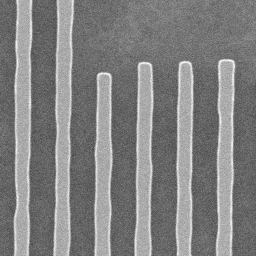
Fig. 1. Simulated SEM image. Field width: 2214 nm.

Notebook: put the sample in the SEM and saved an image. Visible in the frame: groups of lines, slits or small figures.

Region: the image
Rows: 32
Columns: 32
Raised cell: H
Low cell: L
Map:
LLHHLLLHHLLLLLLLLLLLLLLLLLLLLLLL
LLHHLLLHHLLLLLLLLLLLLLLLLLLLLLLL
LLHHLLLHHLLLLLLLLLLLLLLLLLLLLLLL
LLHHLLLHHLLLLLLLLLLLLLLLLLLLLLLL
LLHHLLLHHLLLLLLLLLLLLLLLLLLLLLLL
LLHHLLLHHLLLLLLLLLLLLLLLLLLLLLLL
LLHHLLLHHLLLLLLLLLLLLLLLLLLLLLLL
LLHHLLLHHLLLLLLLLLLLLLLLLLLLLLLL
LLHHLLLHHLLLLLLLLHHLLLHHLLLHHLLL
LLHHLLLHHLLLHHLLLHHLLLHHLLLHHLLL
LLHHLLLHHLLLHHLLLHHLLLHHLLLHHLLL
LLHHLLLHHLLLHHLLLHHLLLHHLLLHHLLL
LLHHLLLHHLLLHHLLLHHLLLHHLLLHHLLL
LLHHLLLHHLLLHHLLLHHLLLHHLLLHHLLL
LLHHLLLHHLLLHHLLLHHLLLHHLLLHHLLL
LLHHLLLHHLLLHHLLLHHLLLHHLLLLHLLL
LLHHLLLHHLLLHHLLLHHLLLHHLLLHHLLL
LLHHLLLHHLLLHHLLLHHLLLHHLLLHHLLL
LLHHLLLHHLLLHHLLLHHLLLHHLLLHHLLL
LLHHLLLHHLLLHHLLLHHLLLHHLLLHHLLL
LLHHLLLHHLLLHHLLLHHLLLHHLLLHHLLL
LLHHLLLHHLLLHHLLLHHLLLHHLLLHHLLL
LLHHLLLHHLLLHHLLLHHLLLHHLLLHHLLL
LLHHLLLHHLLLHHLLLHHLLLHHLLLHHLLL
LLHHLLLHHLLLHHLLLHHLLLHHLLLHHLLL
LLHHLLLHHLLLHHLLLHHLLLHHLLLHHLLL
LLHHLLLHHLLLHHLLLHHLLLHHLLLHHLLL
LLHHLLLHHLLLHHLLLHHLLLHHLLLHHLLL
LLHHLLLHHLLLHHLLLHHLLLHHLLLHHLLL
LLHHLLLHHLLLHHLLLHHLLLHHLLLHHLLL
LLHHLLLHHLLLHHLLLHHLLLHHLLLHHLLL
LLHLLLLHHLLLHHLLLHHLLLHHLLLHHLLL